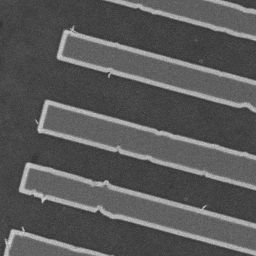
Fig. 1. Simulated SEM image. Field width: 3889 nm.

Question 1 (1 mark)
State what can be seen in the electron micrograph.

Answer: one or a few lines or trenches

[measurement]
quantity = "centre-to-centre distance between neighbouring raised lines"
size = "1.04 µm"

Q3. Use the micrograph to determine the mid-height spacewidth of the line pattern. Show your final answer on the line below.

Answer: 0.65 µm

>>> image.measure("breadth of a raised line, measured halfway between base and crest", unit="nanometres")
396